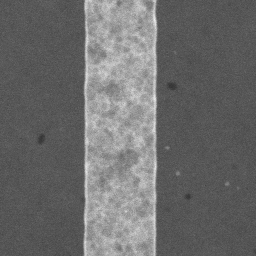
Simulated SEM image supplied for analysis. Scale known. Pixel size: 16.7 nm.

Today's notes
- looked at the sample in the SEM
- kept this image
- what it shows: wiring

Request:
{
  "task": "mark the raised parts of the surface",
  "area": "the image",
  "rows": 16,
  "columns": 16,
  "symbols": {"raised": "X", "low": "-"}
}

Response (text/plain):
-----XXXXX------
-----XXXXX------
-----XXXXX------
-----XXXXX------
-----XXXXX------
-----XXXXX------
-----XXXXX------
-----XXXXX------
-----XXXXX------
-----XXXXX------
-----XXXXX------
-----XXXXX------
-----XXXXX------
-----XXXXX------
-----XXXXX------
-----XXXXX------